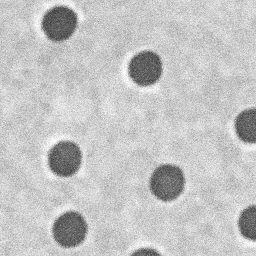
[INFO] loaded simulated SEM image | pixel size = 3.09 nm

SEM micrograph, holes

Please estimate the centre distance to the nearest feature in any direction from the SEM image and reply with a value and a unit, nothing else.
300 nm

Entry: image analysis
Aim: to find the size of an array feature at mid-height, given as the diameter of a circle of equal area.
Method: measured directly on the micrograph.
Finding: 0.118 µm